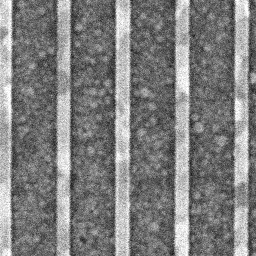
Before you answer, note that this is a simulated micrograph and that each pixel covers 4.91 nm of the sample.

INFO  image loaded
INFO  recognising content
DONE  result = parallel lines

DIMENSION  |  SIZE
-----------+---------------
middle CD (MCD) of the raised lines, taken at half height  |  57.1 nm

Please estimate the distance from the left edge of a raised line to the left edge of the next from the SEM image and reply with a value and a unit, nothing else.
291 nm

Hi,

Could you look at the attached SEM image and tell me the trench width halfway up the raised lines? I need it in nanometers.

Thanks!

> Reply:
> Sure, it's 233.